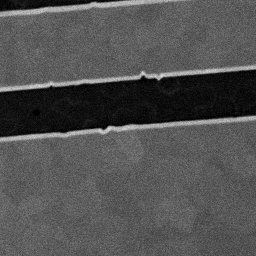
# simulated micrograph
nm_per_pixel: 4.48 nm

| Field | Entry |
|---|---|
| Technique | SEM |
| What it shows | one or a few lines or trenches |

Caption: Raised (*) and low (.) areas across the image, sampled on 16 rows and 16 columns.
....************
****************
****************
****************
*************...
**..............
................
..............**
..**************
****************
****************
****************
****************
****************
****************
****************